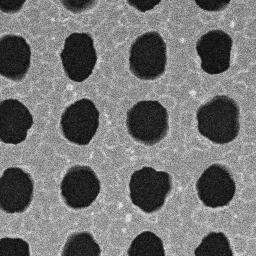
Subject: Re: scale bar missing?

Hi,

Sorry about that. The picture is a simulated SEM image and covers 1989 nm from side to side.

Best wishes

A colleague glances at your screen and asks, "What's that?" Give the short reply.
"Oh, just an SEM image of a regular array of holes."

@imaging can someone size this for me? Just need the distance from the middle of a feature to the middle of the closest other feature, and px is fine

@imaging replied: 65.5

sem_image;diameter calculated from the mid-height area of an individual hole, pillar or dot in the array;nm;322